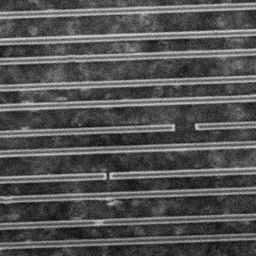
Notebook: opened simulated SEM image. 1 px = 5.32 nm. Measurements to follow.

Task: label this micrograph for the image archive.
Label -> parallel lines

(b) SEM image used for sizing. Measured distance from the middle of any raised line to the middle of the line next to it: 23 pixels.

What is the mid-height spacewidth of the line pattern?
0.095 micrometres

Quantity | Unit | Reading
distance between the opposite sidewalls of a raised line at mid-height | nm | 31.9